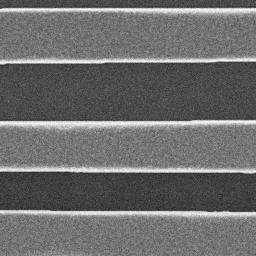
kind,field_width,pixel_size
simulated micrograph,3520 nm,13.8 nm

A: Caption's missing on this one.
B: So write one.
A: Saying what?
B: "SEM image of lines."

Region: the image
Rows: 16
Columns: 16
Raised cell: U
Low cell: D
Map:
DDDDDDDDDDDDDDDD
UUUUUUUUUUUUUUUU
UUUUUUUUUUUUUUUU
UUUUUUUUUUUUUUUU
DDDDDDDDDDDDDDDD
DDDDDDDDDDDDDDDD
DDDDDDDDDDDDDDDD
DDDDDDDDDDDDDDDD
UUUUUUUUUUUUUUUU
UUUUUUUUUUUUUUUU
UUUUUUUUUUUUUUUU
DDDDDDDDDDDDDDDD
DDDDDDDDDDDDDDDD
UUUUUUUUUUUUUUUU
UUUUUUUUUUUUUUUU
UUUUUUUUUUUUUUUU